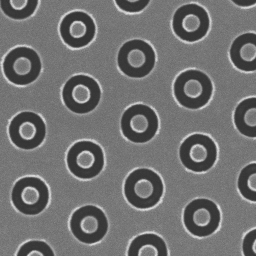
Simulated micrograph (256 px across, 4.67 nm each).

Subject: a regular array of ring-shaped grooves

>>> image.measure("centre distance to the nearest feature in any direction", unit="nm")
302